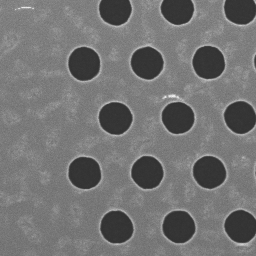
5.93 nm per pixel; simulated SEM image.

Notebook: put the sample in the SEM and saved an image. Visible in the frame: a regular array of holes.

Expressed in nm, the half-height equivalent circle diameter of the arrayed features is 192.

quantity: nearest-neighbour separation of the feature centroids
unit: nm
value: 367